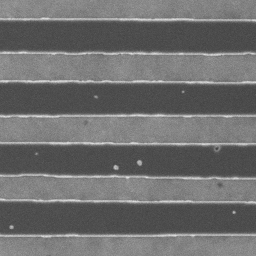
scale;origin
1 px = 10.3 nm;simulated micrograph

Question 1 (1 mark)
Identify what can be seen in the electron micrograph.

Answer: lines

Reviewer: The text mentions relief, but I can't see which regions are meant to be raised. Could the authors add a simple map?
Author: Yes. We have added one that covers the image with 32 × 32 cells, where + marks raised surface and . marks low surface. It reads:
................................
................................
++++++++++++++++++...+++........
++++++++++++++++++++++++++++++++
++++++++++++++++++++++++++++++++
++++++++++++++++++++++++++++++++
++++++++++++++++++++++++++++++++
................................
................................
................................
++++++++++++++++++++++++++++++++
++++++++++++++++++++++++++++++++
++++++++++++++++++++++++++++++++
++++++++++++++++++++++++++++++++
++++.+++....................+...
................................
................................
................................
++++++++++++++++++++++++++++++++
++++++++++++++++++++++++++++++++
++++++++++++++++++++++++++++++++
++++++++++++++++++++++++++++++++
................................
................................
................................
++++++++++++++++++++++++++++++++
++++++++++++++++++++++++++++++++
++++++++++++++++++++++++++++++++
++++++++++++++++++++++++++++++++
.....+..........................
................................
................................